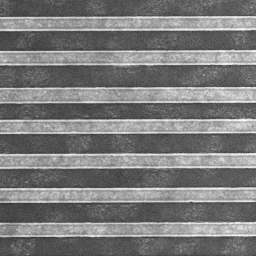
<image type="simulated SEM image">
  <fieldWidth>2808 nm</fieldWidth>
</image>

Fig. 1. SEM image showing parallel lines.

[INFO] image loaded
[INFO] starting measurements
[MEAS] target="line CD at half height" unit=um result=0.137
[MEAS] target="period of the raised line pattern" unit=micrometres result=0.377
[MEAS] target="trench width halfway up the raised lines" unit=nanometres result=236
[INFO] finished